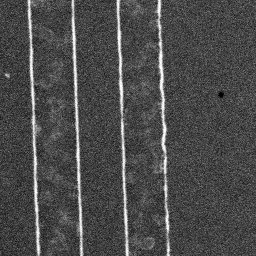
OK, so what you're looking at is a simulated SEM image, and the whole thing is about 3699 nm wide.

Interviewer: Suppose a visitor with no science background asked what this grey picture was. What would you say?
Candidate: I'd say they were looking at one or a few lines or trenches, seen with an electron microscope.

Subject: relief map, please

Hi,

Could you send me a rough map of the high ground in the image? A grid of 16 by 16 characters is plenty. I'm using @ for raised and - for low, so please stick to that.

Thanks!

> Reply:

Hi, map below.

@@---@@---@@@@@@
@@---@@---@@@@@@
@@---@@---@@@@@@
@@---@@@--@@@@@@
@@---@@@--@@@@@@
@@---@@@--@@@@@@
@@---@@@--@@@@@@
@@---@@@--@@@@@@
@@---@@@--@@@@@@
@@---@@@--@@@@@@
@@---@@@--@@@@@@
@@---@@@--@@@@@@
@@---@@@--@@@@@@
@@---@@@--@@@@@@
@@---@@@--@@@@@@
@@---@@@--@@@@@@